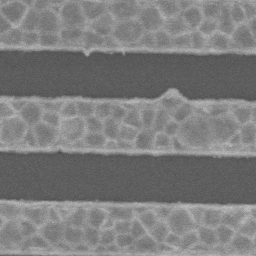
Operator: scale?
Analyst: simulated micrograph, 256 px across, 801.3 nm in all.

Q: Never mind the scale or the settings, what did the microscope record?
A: one or a few lines or trenches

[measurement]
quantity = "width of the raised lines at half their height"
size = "0.155 um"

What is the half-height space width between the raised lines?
53.3 pixels